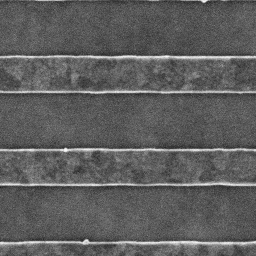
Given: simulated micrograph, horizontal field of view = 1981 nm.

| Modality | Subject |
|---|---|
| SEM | wiring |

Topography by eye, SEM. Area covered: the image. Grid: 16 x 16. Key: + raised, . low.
................
................
................
................
++++++++++++++++
++++++++++++++++
................
................
................
++++++++++++++++
++++++++++++++++
++++++++++++++++
................
................
................
++++++++++++++++